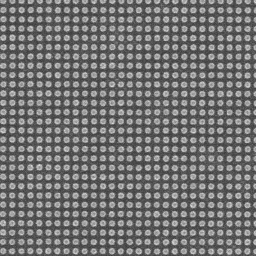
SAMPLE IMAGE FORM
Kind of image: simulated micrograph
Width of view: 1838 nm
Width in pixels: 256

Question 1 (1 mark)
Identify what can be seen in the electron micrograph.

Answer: a regular array of raised bodies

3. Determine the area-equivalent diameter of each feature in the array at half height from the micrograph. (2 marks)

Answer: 39.7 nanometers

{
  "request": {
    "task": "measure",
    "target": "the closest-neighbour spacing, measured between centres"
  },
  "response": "0.0636 µm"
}